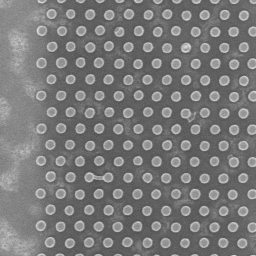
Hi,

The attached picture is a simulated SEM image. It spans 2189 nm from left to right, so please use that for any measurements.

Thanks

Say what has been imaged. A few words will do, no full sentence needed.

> a regular array of raised bodies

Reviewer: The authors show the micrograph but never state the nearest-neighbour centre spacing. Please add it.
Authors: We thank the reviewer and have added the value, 157 nm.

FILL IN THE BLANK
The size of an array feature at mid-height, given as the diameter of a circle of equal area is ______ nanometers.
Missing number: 83